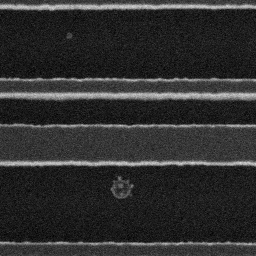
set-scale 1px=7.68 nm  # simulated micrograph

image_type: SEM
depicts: lines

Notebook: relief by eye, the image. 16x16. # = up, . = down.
................
................
................
................
................
################
################
################
################
################
................
................
................
................
................
################